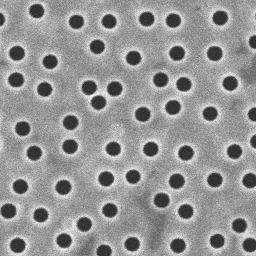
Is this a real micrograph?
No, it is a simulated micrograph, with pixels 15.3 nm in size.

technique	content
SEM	a regular array of holes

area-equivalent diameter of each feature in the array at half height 15.8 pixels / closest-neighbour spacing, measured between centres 27.9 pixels